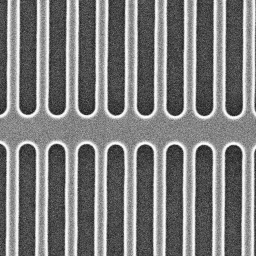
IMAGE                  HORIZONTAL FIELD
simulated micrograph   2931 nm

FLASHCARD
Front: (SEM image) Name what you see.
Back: groups of lines, slits or small figures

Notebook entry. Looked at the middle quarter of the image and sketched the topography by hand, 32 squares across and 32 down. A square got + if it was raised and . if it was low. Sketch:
.++.....+++....+++.....++.....++
.++.....+++....+++.....++.....++
.++.....+++....+++.....++.....++
.++.....+++....+++.....++.....++
.++.....+++....+++.....++.....++
.++.....+++....+++.....++.....++
.++.....+++....+++.....++.....++
.++.....+++....+++.....++.....++
.++.....+++....+++.....++.....++
.++.....+++....+++.....++.....++
.++.....+++....+++.....++.....++
++++....+++....+++.....+++....++
++++...+++++...++++...++++...+++
++++++++++++++++++++++++++++++++
++++++++++++++++++++++++++++++++
++++++++++++++++++++++++++++++++
++++++++++++++++++++++++++++++++
++++++++++++++++++++++++++++++++
++++++++++++++++++++++++++++++++
++++++++++++++++++++++++++++++++
++++...+++++..+++++...++++...+++
+++.....+++....+++....++++....++
.++.....+++....+++.....++.....++
.++.....+++....+++.....++.....++
.++.....+++....+++.....++.....++
.++.....+++....+++.....++.....++
.++.....++.....+++.....++.....++
.++.....++.....+++.....++.....++
.++.....++.....+++.....++.....++
.++.....++.....+++.....++.....++
+++.....++.....+++.....++.....++
+++.....++.....+++.....++.....++